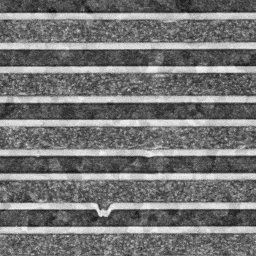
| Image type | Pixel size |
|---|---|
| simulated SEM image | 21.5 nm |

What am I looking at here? parallel lines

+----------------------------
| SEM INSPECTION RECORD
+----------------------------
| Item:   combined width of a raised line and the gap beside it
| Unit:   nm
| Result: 1150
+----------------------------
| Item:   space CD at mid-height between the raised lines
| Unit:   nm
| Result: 645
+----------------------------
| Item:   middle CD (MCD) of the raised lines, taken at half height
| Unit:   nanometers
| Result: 495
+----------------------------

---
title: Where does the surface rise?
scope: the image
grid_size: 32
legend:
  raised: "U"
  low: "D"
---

UUUUUUUUUUUUUUUUUUUUUUUUUUUUUUUU
UUUUUUUUUUUUUUUUUUUUUUUUUUUUUUUU
DDDDDDDDDDDDDDDDDDDDDDDDDDDDDDDD
DDDDDDDDDDDDDDDDDDDDDDDDDDDDDDDD
DDDDDDDDDDDDDDDDDDDDDDDDDDDDDDDD
DDDDDDDDDDDDDDDDDDDDDDDDDDDDDDDD
UUUUUUUUUUUUUUUUUUUUUUUUUUUUUUUU
UUUUUUUUUUUUUUUUUUUUUUUUUUUUUUUU
UUUUUUUUUUUUUUUUUUUUUUUUUUUUUUUU
DDDDDDDDDDDDDDDDDDDDDDDDDDDDDDDD
DDDDDDDDDDDDDDDDDDDDDDDDDDDDDDDD
DDDDDDDDDDDDDDDDDDDDDDDDDDDDDDDD
DDDDDDDDDDDDDDDUUUUUUUUUUUUUUUUU
UUUUUUUUUUUUUUUUUUUUUUUUUUUUUUUU
UUUUUUUUUUUUUUUUUUUUUUUUUUUUUUUU
DDDDDDDDDDDDDDDDDDDDDDDDDDDDDDDD
DDDDDDDDDDDDDDDDDDDDDDDDDDDDDDDD
DDDDDDDDDDDDDDDDDDDDDDDDDDDDDDDD
DDDDDDDDDDDDDDDDDDDDDDDDDDDDDDDD
UUUUUUUUUUUUUUUUUUUUUUUUUUUUUUUU
UUUUUUUUUUUUUUUUUUUUUUUUUUUUUUUU
UUUUUUUUUUUUUUUUUUUUUUUUUUUUUUUU
DDDDDDDDDDDDDDDDDDDDDDDDDDDDDDDD
DDDDDDDDDDDDDDDDDDDDDDDDDDDDDDDD
DDDDDDDDDDDDDDDDDDDDDDDDDDDDDDDD
DDDDDDDDDDDDDDDDDDDDDDDDDDDDDDDD
UUUUUUUUUUUUUUUUUUUUUUUUUUUUUUUU
UUUUUUUUUUUUUUUUUUUUUUUUUUUUUUUU
UUUUUUUUUUUUUUUUUUUUUUUUUUUUUUUU
DDDDDDDDDDDDDDDDDDDDDDDDDDDDDDDD
DDDDDDDDDDDDDDDDDDDDDDDDDDDDDDDD
DDDDDDDDDDDDDDDDDDDDDDDDDDDDDDDD